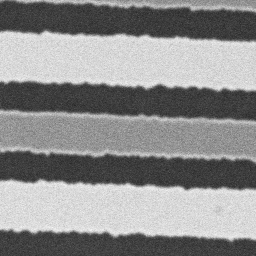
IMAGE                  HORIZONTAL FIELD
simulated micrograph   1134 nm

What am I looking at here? lines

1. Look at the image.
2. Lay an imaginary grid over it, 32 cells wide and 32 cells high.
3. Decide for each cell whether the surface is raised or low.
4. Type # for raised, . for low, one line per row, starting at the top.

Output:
............####################
................................
................................
................................
############..##................
################################
################################
################################
################################
################################
.............###################
................................
................................
................................
###############..#..............
################################
################################
################################
################################
...................#############
................................
................................
................................
####################.##.........
################################
################################
################################
################################
################################
.....................##.########
................................
................................